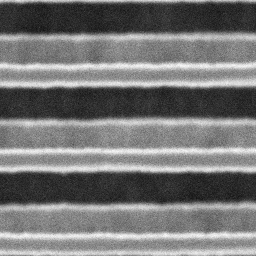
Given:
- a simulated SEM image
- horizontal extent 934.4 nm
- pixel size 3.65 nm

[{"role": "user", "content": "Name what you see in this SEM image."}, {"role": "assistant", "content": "lines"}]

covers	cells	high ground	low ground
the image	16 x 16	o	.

................
................
oooooooooooooooo
oooooooooooooooo
oooooooooooooooo
................
................
................
oooooooooooooooo
oooooooooooooooo
oooooooooooooooo
................
................
oooooooooooooooo
oooooooooooooooo
oooooooooooooooo